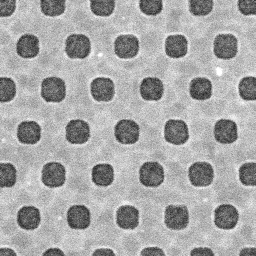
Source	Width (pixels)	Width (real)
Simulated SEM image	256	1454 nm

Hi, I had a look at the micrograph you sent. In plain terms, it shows a regular array of holes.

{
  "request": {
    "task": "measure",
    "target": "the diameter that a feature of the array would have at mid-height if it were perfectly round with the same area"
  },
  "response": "26.7 pixels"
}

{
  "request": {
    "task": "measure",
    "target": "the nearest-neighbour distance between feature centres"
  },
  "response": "278 nm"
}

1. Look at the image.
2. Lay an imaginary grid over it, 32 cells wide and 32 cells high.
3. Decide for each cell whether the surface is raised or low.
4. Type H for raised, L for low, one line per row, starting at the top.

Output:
LLHHHLLLHHHLLLHHHLLLHHHLLLLHHHLL
LLHHHLLLHHHLLLHHHHLLHHHHLLHHHHLL
HHHHHHHHHHHHHHHHHHHHHHHHHHHHHHHH
HHHHHHHHHHHHHHHHHHHHHHHHHHHHHHHH
HHHLHHHHHLLHHHHLLHHHHLLHHHHLLHHH
HHLLLHHHLLLHHHLLLHHHHLLLHHHLLLHH
HHLLLHHHLLLHHHLLLHHHHLLHHHHLLLHH
HHHHHHHHHHHHHHHHHHHHHHHHHHHHHHHH
HHHHHHHHHHHHHHHHHHHHHHHHHHHHHHHH
HHHHHHHHHHHHHHHHHHHHHHHHHHHHHHHH
LLHHHLLLHHHLLLHHHLLLHHHHLLHHHHLL
LLHHHLLLHHHLLLHHHLLLHHHHLLHHHHLL
LHHHHLLLHHHHLLHHHHLLHHHHLLHHHHLL
HHHHHHHHHHHHHHHHHHHHHHHHHHHHHHHH
HHHHHHHHHHHHHHHHHHHHHHHHHHHHHHHH
HHLLLHHHLLLHHHLLLHHHHLLHHHHLLLHH
HHLLLHHHLLLHHHLLLLHHLLLLHHHLLLHH
HHLLLHHHLLLHHHHLLHHHHLLHHHHLLLHH
HHHHHHHHHHHHHHHHHHHHHHHHHHHHHHHH
HHHHHHHHHHHHHHHHHHHHHHHHHHHHHHHH
LHHHHHLLHHHHLLHHHHLLHHHHLLHHHHLL
LLHHHLLLHHHLLLHHHLLLLHHLLLLHHHLL
LLHHHLLLHHHLLLHHHLLLLHHHLLLHHHLL
HHHHHHLHHHHHHHHHHHHHHHHHHHHHHHHH
HHHHHHHHHHHHHHHHHHHHHHHHHHHHHHHH
HHHHHHHHHHHHHHHHHHHHHHLHHHHHLHHH
HHLLLHHHLLLHHHLLLHHHLLLLHHHLLLHH
HHLLLHHHLLLHHHLLLHHHLLLLHHHLLLHH
HHHLLHHHHLLHHHHLLHHHHLLHHHHLLHHH
HHHHHHHHHHHHHHHHHHHHHHHHHHHHHHHH
HHHHHHHHHHHHHHHHHHHHHHHHHHHHHHHH
LLHHHHLLHHHHLLHHHHLLHHHHLLLHHHLL